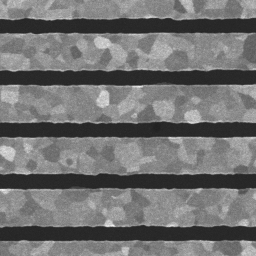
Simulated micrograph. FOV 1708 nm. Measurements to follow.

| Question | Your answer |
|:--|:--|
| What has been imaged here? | lines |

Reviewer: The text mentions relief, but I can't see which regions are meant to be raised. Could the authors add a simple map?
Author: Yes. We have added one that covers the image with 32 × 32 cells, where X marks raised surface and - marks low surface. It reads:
XXXXXXXXXXXXXXXXXXXXXXXXXXXXXXXX
XXXXXXXXXXXXXXXXXXXXXXXXXXXXXXXX
--------------------------------
--------------------------------
XXXXXXXXXXXXXXXXXXXXXXXXXXXXXXXX
XXXXXXXXXXXXXXXXXXXXXXXXXXXXXXXX
XXXXXXXXXXXXXXXXXXXXXXXXXXXXXXXX
XXXXXXXXXXXXXXXXXXXXXXXXXXXXXXXX
XXXXXXXXXXXXXXXXXXXXXXXXXXXXXXXX
--------------------------------
--------------------------------
XXXXXXXXXXXXXXXXXXXXXXXXXXXXXXXX
XXXXXXXXXXXXXXXXXXXXXXXXXXXXXXXX
XXXXXXXXXXXXXXXXXXXXXXXXXXXXXXXX
XXXXXXXXXXXXXXXXXXXXXXXXXXXXXXXX
--------------------------------
--------------------------------
XXXXXXXXXXXXXXXXXXXXXXXXXXXXXXXX
XXXXXXXXXXXXXXXXXXXXXXXXXXXXXXXX
XXXXXXXXXXXXXXXXXXXXXXXXXXXXXXXX
XXXXXXXXXXXXXXXXXXXXXXXXXXXXXXXX
XXXXXXXXXXXXXXXXXXXXXXXXXXXXXXXX
--------------------------------
--------------------------------
XXXXXXXXXXXXXXXXXXXXXXXXXXXXXXXX
XXXXXXXXXXXXXXXXXXXXXXXXXXXXXXXX
XXXXXXXXXXXXXXXXXXXXXXXXXXXXXXXX
XXXXXXXXXXXXXXXXXXXXXXXXXXXXXXXX
--------------------------------
--------------------------------
XXXXXXXXXXXXXXXXXXXXXXXXXXXXXXXX
XXXXXXXXXXXXXXXXXXXXXXXXXXXXXXXX